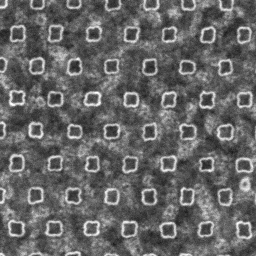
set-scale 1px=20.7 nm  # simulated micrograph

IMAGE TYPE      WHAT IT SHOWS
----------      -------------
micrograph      a regular array of raised bodies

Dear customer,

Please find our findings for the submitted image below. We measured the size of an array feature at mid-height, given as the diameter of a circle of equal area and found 320 nm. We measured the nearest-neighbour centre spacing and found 0.768 µm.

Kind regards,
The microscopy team